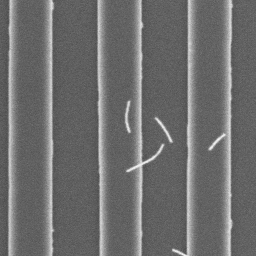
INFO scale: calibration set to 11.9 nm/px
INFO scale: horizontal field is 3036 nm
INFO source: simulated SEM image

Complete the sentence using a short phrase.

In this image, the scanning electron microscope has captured lines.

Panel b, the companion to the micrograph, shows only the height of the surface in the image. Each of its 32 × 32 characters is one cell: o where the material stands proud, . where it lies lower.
.ooooo......oooooo......ooooo...
.ooooo......oooooo......ooooo...
.ooooo......oooooo......ooooo...
.ooooo......oooooo......ooooo...
.ooooo......oooooo......ooooo...
.ooooo......oooooo......ooooo...
.ooooo......oooooo......ooooo...
.ooooo......oooooo......ooooo...
.ooooo......oooooo......ooooo...
.ooooo......oooooo......ooooo...
.ooooo......oooooo......ooooo...
.ooooo......oooooo......ooooo...
.ooooo......oooooo......ooooo...
.ooooo......oooooo......ooooo...
.ooooo......oooooo......ooooo...
.ooooo......oooooo......ooooo...
.ooooo......oooooo......ooooo...
.ooooo......oooooo......ooooo...
.ooooo......oooooo......ooooo...
.ooooo......oooooo......ooooo...
.ooooo......oooooo......ooooo...
.ooooo.......ooooo......ooooo...
.ooooo.......ooooo.....oooooo...
.ooooo.......ooooo.....oooooo...
.ooooo.......ooooo.....oooooo...
.ooooo.......ooooo.....oooooo...
.ooooo.......ooooo.....oooooo...
.ooooo.......ooooo.....oooooo...
.ooooo.......ooooo.....oooooo...
.ooooo.......ooooo.....oooooo...
.ooooo.......ooooo.....oooooo...
.ooooo.......ooooo.....oooooo...